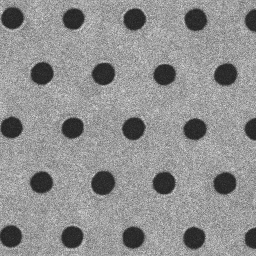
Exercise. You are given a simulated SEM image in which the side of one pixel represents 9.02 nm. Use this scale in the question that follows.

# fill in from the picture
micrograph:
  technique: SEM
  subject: a regular array of holes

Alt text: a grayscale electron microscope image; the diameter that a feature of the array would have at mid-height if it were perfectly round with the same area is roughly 200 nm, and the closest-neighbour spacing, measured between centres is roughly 0.55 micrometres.